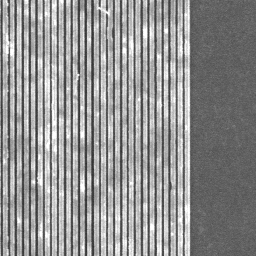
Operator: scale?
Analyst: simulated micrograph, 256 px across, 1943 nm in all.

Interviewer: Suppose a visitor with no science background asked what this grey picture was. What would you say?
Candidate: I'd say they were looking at parallel lines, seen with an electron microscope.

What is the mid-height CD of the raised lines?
30.4 nm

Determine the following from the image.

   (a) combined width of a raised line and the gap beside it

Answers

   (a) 0.0532 µm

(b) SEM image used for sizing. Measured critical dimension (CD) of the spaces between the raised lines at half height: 22.8 nm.